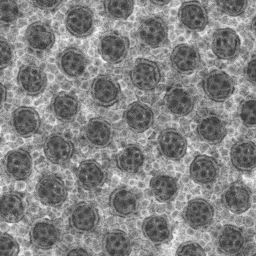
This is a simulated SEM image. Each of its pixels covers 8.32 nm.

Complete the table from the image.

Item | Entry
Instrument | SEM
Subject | a regular array of raised bodies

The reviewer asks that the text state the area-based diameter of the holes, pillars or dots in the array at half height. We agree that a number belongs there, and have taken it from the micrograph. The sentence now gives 26.8 px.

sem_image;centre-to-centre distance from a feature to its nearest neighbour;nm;351